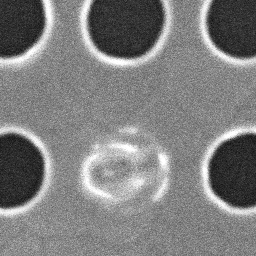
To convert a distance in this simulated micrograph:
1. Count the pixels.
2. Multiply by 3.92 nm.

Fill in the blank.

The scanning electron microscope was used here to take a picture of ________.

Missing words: holes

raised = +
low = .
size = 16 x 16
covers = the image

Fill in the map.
...+++....+++...
...++.....+++...
..++++....+++...
.++++++..+++++..
++++++++++++++++
++++++++++++++++
++++++++++++++++
++++++++++++++++
..+++++++++++++.
...++++++++++...
...++++++++++...
...++++++++++...
..++++++++++++..
++++++++++++++++
++++++++++++++++
++++++++++++++++